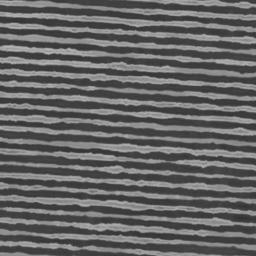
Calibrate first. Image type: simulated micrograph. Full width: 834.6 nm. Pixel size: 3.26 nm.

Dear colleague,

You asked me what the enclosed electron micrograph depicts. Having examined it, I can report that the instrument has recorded parallel lines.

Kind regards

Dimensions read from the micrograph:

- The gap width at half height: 19.1 nanometers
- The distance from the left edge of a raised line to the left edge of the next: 37.4 nm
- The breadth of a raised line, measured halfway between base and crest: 0.0191 microns